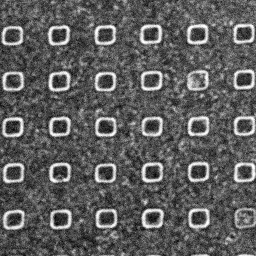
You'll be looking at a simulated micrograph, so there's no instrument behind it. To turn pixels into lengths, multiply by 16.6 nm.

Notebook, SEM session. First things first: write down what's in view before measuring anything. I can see a regular array of raised bodies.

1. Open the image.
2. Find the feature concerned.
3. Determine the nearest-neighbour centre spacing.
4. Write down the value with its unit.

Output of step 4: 759 nanometers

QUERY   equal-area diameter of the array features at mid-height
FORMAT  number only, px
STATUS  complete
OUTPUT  19.4